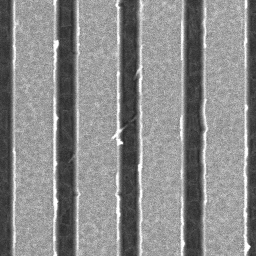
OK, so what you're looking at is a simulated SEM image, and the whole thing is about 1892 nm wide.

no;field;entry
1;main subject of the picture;one or a few lines or trenches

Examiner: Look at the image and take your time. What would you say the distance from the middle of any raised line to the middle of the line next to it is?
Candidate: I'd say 63.5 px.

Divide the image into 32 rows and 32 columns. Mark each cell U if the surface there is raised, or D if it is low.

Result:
DDUUUUUDDUUUUUUDDUUUUUUDDUUUUUUD
DDUUUUUDDUUUUUUDDUUUUUUDDUUUUUUD
DDUUUUUDDUUUUUUDDUUUUUUDDUUUUUUD
DDUUUUUDDUUUUUUDDUUUUUUDDUUUUUUD
DDUUUUUDDUUUUUUDDUUUUUUDDUUUUUUD
DDUUUUUDDUUUUUUDDUUUUUUDDUUUUUUD
DDUUUUUDDUUUUUUDDUUUUUUDDUUUUUUD
DDUUUUUDDUUUUUUDDUUUUUUDDUUUUUUD
DDUUUUUDDUUUUUUDDUUUUUUDDUUUUUUD
DDUUUUUDDUUUUUUDDUUUUUUDDUUUUUUD
DDUUUUUDDUUUUUUDDUUUUUUDDUUUUUUD
DDUUUUUDDUUUUUUDDUUUUUUDDUUUUUUD
DDUUUUUDDUUUUUUDDUUUUUUDDUUUUUUD
DDUUUUUDDUUUUUUDDUUUUUUDDUUUUUUD
DDUUUUUDDUUUUUUDDUUUUUUDDUUUUUUD
DDUUUUUDDUUUUUUDDUUUUUUDDUUUUUUD
DDUUUUUDDUUUUUUDDUUUUUUDDUUUUUUD
DDUUUUUDDUUUUUUDDUUUUUUDDUUUUUUD
DDUUUUUDDUUUUUUDDUUUUUUDDUUUUUUD
DDUUUUUDDUUUUUUDDUUUUUUDDUUUUUUD
DDUUUUUDDUUUUUUDDUUUUUUDDUUUUUUD
DDUUUUUDDUUUUUUDDUUUUUUDDUUUUUUD
DDUUUUUDDUUUUUUDDUUUUUUDDUUUUUUD
DDUUUUUDDUUUUUUDDUUUUUUDDUUUUUUD
DDUUUUUDDUUUUUUDDUUUUUUDDUUUUUUD
DDUUUUUDDUUUUUUDDUUUUUUDDUUUUUUD
DDUUUUUDDUUUUUUDDUUUUUUDDUUUUUUD
DDUUUUUDDUUUUUUDDUUUUUUDDUUUUUUD
DDUUUUUDDUUUUUUDDUUUUUUDDUUUUUUD
DDUUUUUDDUUUUUUDDUUUUUUDDUUUUUUD
DDUUUUUDDUUUUUUDDUUUUUUDDUUUUUUD
DDUUUUUDDUUUUUUDDUUUUUUDDUUUUUUD